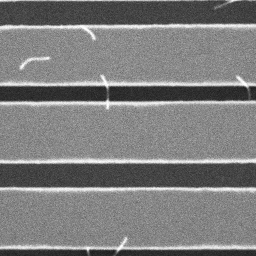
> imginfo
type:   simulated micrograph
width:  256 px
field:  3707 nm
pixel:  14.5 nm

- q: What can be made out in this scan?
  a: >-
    lines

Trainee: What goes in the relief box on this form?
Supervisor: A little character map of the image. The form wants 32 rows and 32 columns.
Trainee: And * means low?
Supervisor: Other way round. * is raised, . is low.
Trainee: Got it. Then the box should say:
................................
................................
................................
********************************
********************************
********************************
********************************
********************************
********************************
********************************
********************************
................................
................................
********************************
********************************
********************************
********************************
********************************
********************************
********************************
................................
................................
................................
................................
********************************
********************************
********************************
********************************
********************************
********************************
********************************
................................